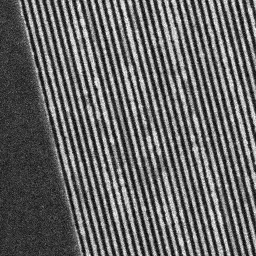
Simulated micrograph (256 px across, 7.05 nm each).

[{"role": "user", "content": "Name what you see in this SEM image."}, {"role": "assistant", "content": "parallel lines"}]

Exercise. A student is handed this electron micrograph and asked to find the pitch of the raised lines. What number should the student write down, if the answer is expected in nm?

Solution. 50.6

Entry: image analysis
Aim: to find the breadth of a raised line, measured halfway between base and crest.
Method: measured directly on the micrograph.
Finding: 18.8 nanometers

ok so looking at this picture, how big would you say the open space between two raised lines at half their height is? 30.8 nm